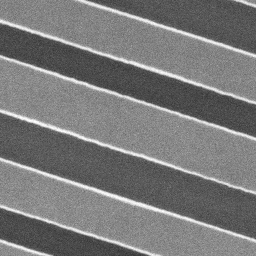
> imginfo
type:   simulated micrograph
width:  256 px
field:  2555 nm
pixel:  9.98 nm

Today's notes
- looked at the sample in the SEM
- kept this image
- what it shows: lines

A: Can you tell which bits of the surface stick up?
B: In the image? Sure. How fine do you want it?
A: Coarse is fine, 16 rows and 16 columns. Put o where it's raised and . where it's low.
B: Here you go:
ooooooo.........
oooooooooo......
...oooooooooo...
.......ooooooooo
ooo.......oooooo
oooooo.......ooo
ooooooooo.......
.oooooooooooo...
.....ooooooooooo
........oooooooo
oo.........ooooo
ooooo.........oo
oooooooo........
..ooooooooo.....
.....ooooooooo..
oo......oooooooo